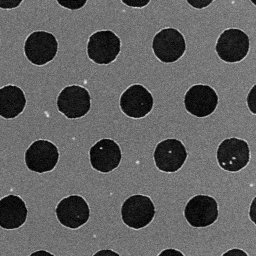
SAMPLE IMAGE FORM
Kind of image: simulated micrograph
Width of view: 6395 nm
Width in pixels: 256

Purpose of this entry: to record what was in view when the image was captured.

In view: a regular array of holes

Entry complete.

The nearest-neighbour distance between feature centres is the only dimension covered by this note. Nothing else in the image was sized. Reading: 1570 nm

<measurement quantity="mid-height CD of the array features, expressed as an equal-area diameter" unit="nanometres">850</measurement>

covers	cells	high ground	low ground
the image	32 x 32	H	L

LLHHHHHLLLLHHHHHLLHHHHHHLLHHHHHH
HHHHHHHHHHHHHHHHHHHHHHHHHHHHHHHH
HHHHHHHHHHHHHHHHHHHHHHHHHHHHHHHH
HHHHHHHHHHHHHHHHHHHHHHHHHHHHHHHH
HHHHLLLHHHHLLLLHHHHLLLLHHHHLLLLH
HHHLLLLHHHHLLLLHHHHLLLLHHHHLLLLH
HHHLLLLHHHHLLLLHHHHLLLLHHHHLLLLH
HHHHLLHHHHHLLLHHHHHHLLHHHHHHLLHH
HHHHHHHHHHHHHHHHHHHHHHHHHHHHHHHH
HHHHHHHHHHHHHHHHHHHHHHHHHHHHHHHH
HHHHHHHHHHHHHHHHHHHHHHHHHHHHHHHH
LLLHHHHHLLLHHHHLLLLHHHHLLLLHHHHL
LLLHHHHLLLLHHHHLLLLHHHHLLLLHHHHL
LLLHHHHLLLLHHHHLLLLHHHHLLLLHHHHL
LLHHHHHHLLHHHHHHLLHHHHHHLLHHHHHH
HHHHHHHHHHHHHHHHHHHHHHHHHHHHHHHH
HHHHHHHHHHHHHHHHHHHHHHHHHHHHHHHH
HHHHHLHHHHHHLLHHHHHHHLHHHHHHLLHH
HHHHLLLHHHHLLLLHHHHLLLLHHHHLLLLH
HHHLLLLHHHHLLLLHHHHLLLLHHHHLLLLH
HHHLLLLHHHHLLLLHHHHLLLLHHHHLLLLH
HHHHLLHHHHHHHLHHHHHHHLHHHHHHHHHH
HHHHHHHHHHHHHHHHHHHHHHHHHHHHHHHH
HHHHHHHHHHHHHHHHHHHHHHHHHHHHHHHH
HLHHHHHHHLHHHHHHLLHHHHHHLLHHHHHH
LLLHHHHLLLLHHHHLLLLHHHHLLLLHHHHL
LLLHHHHLLLLHHHHLLLLHHHHLLLLHHHHL
LLLHHHHLLLLHHHHLLLLHHHHLLLLHHHHL
LLHHHHHHHLHHHHHHLLHHHHHHHHHHHHHH
HHHHHHHHHHHHHHHHHHHHHHHHHHHHHHHH
HHHHHHHHHHHHHHHHHHHHHHHHHHHHHHHH
HHHHLLHHHHHHLLHHHHHHLLLHHHHHLLLH